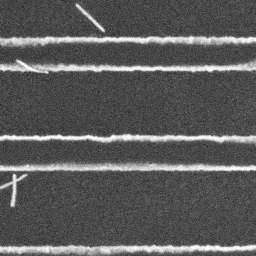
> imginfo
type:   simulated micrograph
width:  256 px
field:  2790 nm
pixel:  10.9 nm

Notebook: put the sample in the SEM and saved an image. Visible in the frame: lines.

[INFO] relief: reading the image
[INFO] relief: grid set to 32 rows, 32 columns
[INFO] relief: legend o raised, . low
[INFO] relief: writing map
................................
................................
................................
................................
................................
oooooooooooooooooooooooooooooooo
oooooooooooooooooooooooooooooooo
oooooooooooooooooooooooooooooooo
ooooooooooooooooooooooooooooooo.
................................
................................
................................
................................
................................
................................
................................
................................
oooooooooooooooooooooooooooooooo
oooooooooooooooooooooooooooooooo
oooooooooooooooooooooooooooooooo
oooooooooooooooooooooooooooooooo
................................
................................
................................
................................
................................
................................
................................
................................
................................
................................
oooooooooooooooooooooooooooooooo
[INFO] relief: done